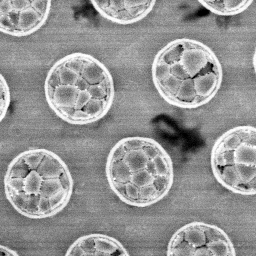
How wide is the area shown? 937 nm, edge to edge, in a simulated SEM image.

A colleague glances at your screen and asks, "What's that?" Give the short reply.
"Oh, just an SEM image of raised bodies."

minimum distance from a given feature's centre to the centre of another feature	373	nanometres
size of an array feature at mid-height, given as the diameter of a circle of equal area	0.239	um